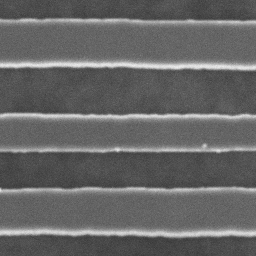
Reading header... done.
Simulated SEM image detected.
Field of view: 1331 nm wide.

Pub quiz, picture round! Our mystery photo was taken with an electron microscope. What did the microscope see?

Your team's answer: lines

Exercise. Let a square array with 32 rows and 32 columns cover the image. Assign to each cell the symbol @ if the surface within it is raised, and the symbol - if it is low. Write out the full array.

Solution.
--------------------------------
--------------------------------
@-@@@@@@@@@@@@@@----------------
@@@@@@@@@@@@@@@@@@@@@@@@@@@@@@@@
@@@@@@@@@@@@@@@@@@@@@@@@@@@@@@@@
@@@@@@@@@@@@@@@@@@@@@@@@@@@@@@@@
@@@@@@@@@@@@@@@@@@@@@@@@@@@@@@@@
@@@@@@@@@@@@@@@@@@@@@@@@@@@@@@@@
--------------------------------
--------------------------------
--------------------------------
--------------------------------
--------------------------------
--------------------------------
@@@@@@@@@@@@@@@@@@@@@@@@@@@@@@@@
@@@@@@@@@@@@@@@@@@@@@@@@@@@@@@@@
@@@@@@@@@@@@@@@@@@@@@@@@@@@@@@@@
@@@@@@@@@@@@@@@@@@@@@@@@@@@@@@@@
@@@@@@@@@@@@@@@@@@@@@@@@@@@@@@@@
--------------------------------
--------------------------------
--------------------------------
--------------------------------
--------------------------------
@@@@@@@@@@@@@@@@@@@@@@@@@@@@@@@@
@@@@@@@@@@@@@@@@@@@@@@@@@@@@@@@@
@@@@@@@@@@@@@@@@@@@@@@@@@@@@@@@@
@@@@@@@@@@@@@@@@@@@@@@@@@@@@@@@@
@@@@@@@@@@@@@@@@@@@@@@@@@@@@@@@@
--------------------------------
--------------------------------
--------------------------------